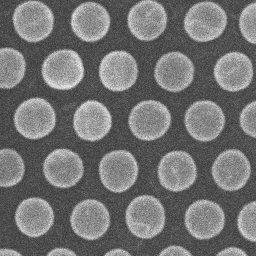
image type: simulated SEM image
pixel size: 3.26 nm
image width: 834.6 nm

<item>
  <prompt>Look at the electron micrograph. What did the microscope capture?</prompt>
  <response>a regular array of raised bodies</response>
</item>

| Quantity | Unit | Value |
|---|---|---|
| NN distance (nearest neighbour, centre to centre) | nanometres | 180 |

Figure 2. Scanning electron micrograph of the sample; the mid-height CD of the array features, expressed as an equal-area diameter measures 128 nm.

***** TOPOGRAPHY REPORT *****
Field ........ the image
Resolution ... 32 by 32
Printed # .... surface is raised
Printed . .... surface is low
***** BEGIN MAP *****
...##......#.....###.....##.....
..####...####...#####...####..##
..#####..#####..#####..#####..##
..####...####...#####..#####..##
...###....###....###....###....#
................................
##.....##.....##................
###...####...####...####...####.
###..#####..#####..#####...#####
###..#####..#####..#####...####.
##....####...####...####...####.
................................
....#...........................
..#####...###....####...####...#
..#####..#####..#####..#####..##
..#####..#####..#####..#####..##
...###....###....####...####...#
...........#.............#......
................................
##....####...###.....###...####.
###...####...####...####...####.
###..#####...####...#####..####.
###...####...####...####...####.
.............###.....##.....##..
................................
...###....###...####....###....#
..#####..####...#####..#####..##
..#####..#####..#####..#####..##
..####...####...####...#####..##
....#.....##.....##.....###....#
................................
##....###.....##....###.....##..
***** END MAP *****